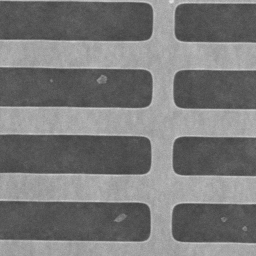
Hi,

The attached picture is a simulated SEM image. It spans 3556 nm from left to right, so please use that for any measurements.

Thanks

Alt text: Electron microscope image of groups of lines, slits or small figures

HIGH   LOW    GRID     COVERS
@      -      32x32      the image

-------------------@@@@---------
-------------------@@@----------
-------------------@@@----------
-------------------@@@----------
-------------------@@@----------
@@@@@@@@@@@@@@@@@@@@@@@@@@@@@@@@
@@@@@@@@@@@@@@@@@@@@@@@@@@@@@@@@
@@@@@@@@@@@@@@@@@@@@@@@@@@@@@@@@
------@@@@@@@@@@@@@@@@@@@@@@@@@@
-------------------@@@----------
-------------------@@@----------
-------------------@@@----------
-------------------@@@----------
@@@@@@@@@---------@@@@@---------
@@@@@@@@@@@@@@@@@@@@@@@@@@@@@@@@
@@@@@@@@@@@@@@@@@@@@@@@@@@@@@@@@
@@@@@@@@@@@@@@@@@@@@@@@@@@@@@@@@
-------------------@@@----------
-------------------@@@----------
-------------------@@@----------
-------------------@@@----------
-------------------@@@----------
@@@@@@@@@@@@@@@@@@@@@@@@@@@@@@@@
@@@@@@@@@@@@@@@@@@@@@@@@@@@@@@@@
@@@@@@@@@@@@@@@@@@@@@@@@@@@@@@@@
------------------@@@@----------
-------------------@@@----------
-------------------@@-----------
-------------------@@-----------
-------------------@@@----------
@@@@@@@@@@@@@@@@@@@@@@@@@@@@@@@@
@@@@@@@@@@@@@@@@@@@@@@@@@@@@@@@@